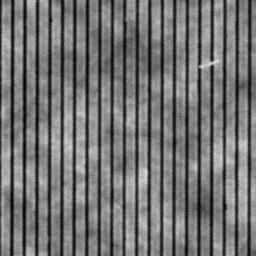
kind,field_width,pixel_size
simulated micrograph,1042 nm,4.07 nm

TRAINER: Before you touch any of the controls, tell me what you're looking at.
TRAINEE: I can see parallel lines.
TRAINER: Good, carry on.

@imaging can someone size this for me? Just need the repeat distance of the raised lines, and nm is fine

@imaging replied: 50.8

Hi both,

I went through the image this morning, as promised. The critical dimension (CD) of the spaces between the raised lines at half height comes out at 4.37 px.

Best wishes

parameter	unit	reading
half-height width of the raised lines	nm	35.6